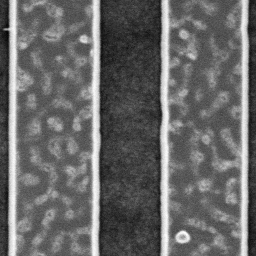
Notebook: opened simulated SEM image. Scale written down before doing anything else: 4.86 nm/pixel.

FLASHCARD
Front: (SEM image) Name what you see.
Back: one or a few lines or trenches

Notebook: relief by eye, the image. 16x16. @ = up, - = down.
-@@@@@----@@@@@-
-@@@@@----@@@@@-
-@@@@@----@@@@@-
-@@@@@----@@@@@-
-@@@@@----@@@@@-
-@@@@@----@@@@@-
-@@@@@----@@@@@-
-@@@@@----@@@@@-
-@@@@@----@@@@@-
-@@@@@----@@@@@-
-@@@@@----@@@@@-
-@@@@@----@@@@@-
-@@@@@----@@@@@-
-@@@@@----@@@@@-
-@@@@@----@@@@@-
-@@@@@----@@@@@-